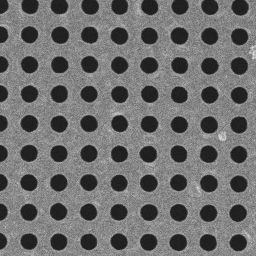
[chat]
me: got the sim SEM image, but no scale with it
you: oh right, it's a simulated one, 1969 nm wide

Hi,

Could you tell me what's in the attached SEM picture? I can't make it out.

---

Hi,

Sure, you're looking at a regular array of holes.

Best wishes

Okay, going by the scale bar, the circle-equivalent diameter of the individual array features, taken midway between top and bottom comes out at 0.13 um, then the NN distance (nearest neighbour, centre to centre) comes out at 225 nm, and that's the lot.